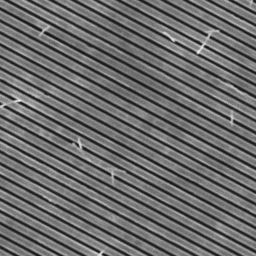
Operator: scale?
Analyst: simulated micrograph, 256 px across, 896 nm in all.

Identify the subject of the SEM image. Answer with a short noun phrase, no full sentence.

parallel lines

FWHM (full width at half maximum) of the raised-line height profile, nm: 26.7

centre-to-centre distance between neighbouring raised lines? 36.9 nanometres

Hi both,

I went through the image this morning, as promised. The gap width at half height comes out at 12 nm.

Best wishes